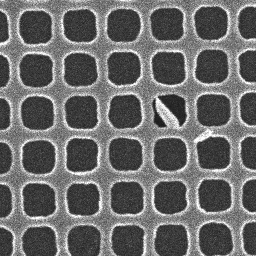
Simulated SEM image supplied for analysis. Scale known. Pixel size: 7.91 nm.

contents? a regular array of holes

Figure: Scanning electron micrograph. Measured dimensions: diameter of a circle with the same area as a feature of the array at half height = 281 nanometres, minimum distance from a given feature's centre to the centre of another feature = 339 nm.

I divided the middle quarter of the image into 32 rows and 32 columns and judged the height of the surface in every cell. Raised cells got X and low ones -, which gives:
--------XXX--------XXX--------XX
--------XXX--------XXX--------XX
--------XXX--------XXX--------XX
--------XXX--------XXXX-------XX
--------XXXX------XXXXX-------XX
X-----XXXXXXX-XXXXXXXXXXXXXXXXXX
XXXXXXXXXXXXXXXXXXXXXXXXXXXXXXXX
XXXXXXXXXXXXXXXXXXXXXXXXXX--XXXX
X------XXXXX-------XXXX-------XX
X-------XXXX-------XXX-X------XX
--------XXX--------XXX-XX-----XX
--------XXX--------XXX-XXX----XX
--------XXX---------XX--XXX----X
--------XXX---------XX--XXXX---X
X-------XXXX-------XXXX--XXXX-XX
X-------XXXX------XXXXX---XXXXXX
XXXXXXXXXXXXXXXXXXXXXXXXXXXXXXXX
XXXXXXXXXXXXXXXXXXXXXXXXXXXXXXXX
XXX--XXXXXXXX---XXXXXXXX-----XXX
X-------XXXX-------XXXX-------XX
X--------XX---------XXX--------X
X--------XX---------XX---------X
X--------XX---------XX---------X
X-------XXX---------XX---------X
X-------XXXX--------XX---------X
--------XXXX-------XXXX-------XX
X------XXXXXX-----XXXXXX----XXXX
XXXXXXXXXXXXXXXXXXXXXXXXXXXXXXXX
XXXXXXXXXXXXXXXXXXXXXXXXXXXXXXXX
XXXXXXXXXXXXX-----XXXXXX------XX
XX------XXXX-------XXXX-------XX
X--------XXX--------XX---------X